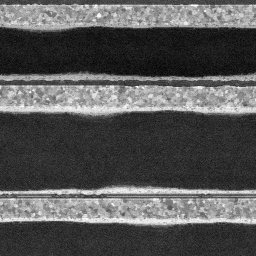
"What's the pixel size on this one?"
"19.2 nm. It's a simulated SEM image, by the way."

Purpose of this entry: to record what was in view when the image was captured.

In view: lines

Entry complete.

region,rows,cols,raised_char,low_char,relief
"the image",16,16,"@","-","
@@@@@@@@@@@@@@@@
---@----@---@@@@
----------------
----------------
----------------
@@@@@@@@@@@@@@@@
@@@@@@@@@@@@@@@@
----------------
----------------
----------------
----------------
----------------
@@@@@@@@@@@@@@@@
@@@@@@@@@@@@@@@@
----------------
----------------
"